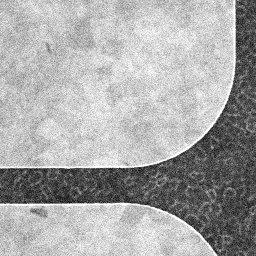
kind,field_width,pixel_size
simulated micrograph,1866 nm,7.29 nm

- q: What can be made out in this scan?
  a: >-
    one or a few lines or trenches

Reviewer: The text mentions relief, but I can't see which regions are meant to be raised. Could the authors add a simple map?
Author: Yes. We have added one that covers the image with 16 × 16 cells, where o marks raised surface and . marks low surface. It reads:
ooooooooooooooo.
ooooooooooooooo.
ooooooooooooooo.
ooooooooooooooo.
ooooooooooooooo.
oooooooooooooo..
oooooooooooooo..
ooooooooooooo...
ooooooooooooo...
ooooooooooo.....
................
................
................
ooooooooooo.....
oooooooooooo....
ooooooooooooo...